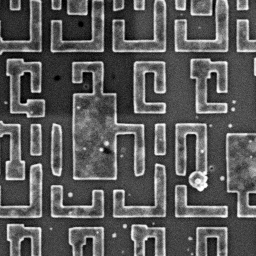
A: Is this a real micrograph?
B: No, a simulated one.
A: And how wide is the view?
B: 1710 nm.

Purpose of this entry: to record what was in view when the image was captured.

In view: wiring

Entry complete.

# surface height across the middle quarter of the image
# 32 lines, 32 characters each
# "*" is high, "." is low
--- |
..********........*******.......
..********........*******.......
..**...***........**...**.......
..**...***........**...**.......
..**...***........**...**.......
.......***........**...**.......
.......***........**...**.......
...**********.....**............
..***********.....**............
..***********.....**............
..***********.....*******.......
..***********.....*******.......
..***********...................
..***********...................
..***********...................
..******************...**...****
..******************...**...****
..************....**...**...***.
..***********.....**...**...**..
..***********.....**...**...**..
..***********.....**...**...**..
..***********.....**...**...**..
..***********.....**...**...**..
..***********.....**........**..
..***********.....**........**..
..***********.....**...**...**..
..***********.....**...**...**..
..***********.....**...**...**..
..***********..........**......*
.......................**......*
.......................**...**..
.......................**...**..